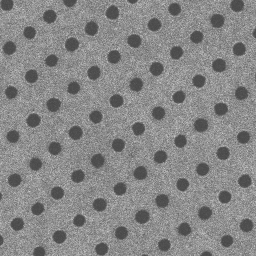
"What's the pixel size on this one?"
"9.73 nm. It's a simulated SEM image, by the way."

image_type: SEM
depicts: a regular array of holes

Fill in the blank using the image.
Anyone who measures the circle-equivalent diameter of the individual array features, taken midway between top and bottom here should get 134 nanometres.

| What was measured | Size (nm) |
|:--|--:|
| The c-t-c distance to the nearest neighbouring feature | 249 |